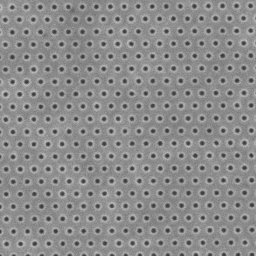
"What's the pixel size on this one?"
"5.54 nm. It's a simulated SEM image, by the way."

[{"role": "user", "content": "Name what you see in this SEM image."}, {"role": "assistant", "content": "a regular array of holes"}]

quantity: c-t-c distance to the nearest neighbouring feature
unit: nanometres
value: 75.8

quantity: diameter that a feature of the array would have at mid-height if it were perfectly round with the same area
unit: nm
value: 27.2